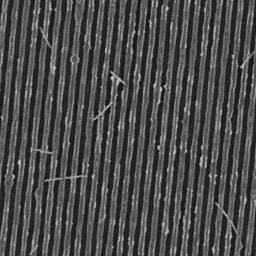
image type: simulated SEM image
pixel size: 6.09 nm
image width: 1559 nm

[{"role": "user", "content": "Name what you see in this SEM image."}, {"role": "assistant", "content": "parallel lines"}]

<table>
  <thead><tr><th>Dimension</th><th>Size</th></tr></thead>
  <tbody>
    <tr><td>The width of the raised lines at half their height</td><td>33.3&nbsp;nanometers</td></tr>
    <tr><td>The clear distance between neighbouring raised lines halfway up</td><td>5.47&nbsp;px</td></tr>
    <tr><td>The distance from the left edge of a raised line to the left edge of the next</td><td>64.9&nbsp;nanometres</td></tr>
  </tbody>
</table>